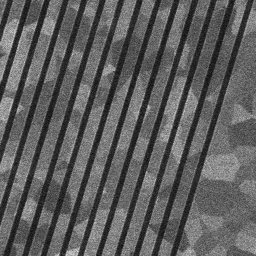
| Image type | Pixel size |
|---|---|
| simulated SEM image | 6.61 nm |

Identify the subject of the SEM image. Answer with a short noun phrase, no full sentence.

parallel lines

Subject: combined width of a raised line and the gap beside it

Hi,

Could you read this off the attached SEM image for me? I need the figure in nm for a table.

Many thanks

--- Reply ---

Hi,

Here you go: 117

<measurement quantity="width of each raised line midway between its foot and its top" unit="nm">71.9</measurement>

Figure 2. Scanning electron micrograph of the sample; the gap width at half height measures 41.9 nanometres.